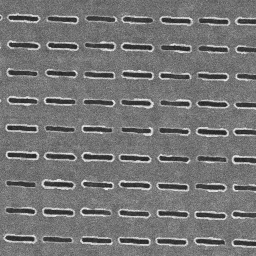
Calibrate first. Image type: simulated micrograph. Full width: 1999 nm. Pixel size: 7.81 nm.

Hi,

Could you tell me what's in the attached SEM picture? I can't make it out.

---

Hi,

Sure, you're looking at a regular array of holes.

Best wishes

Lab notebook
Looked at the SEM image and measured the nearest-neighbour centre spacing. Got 214 nanometres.